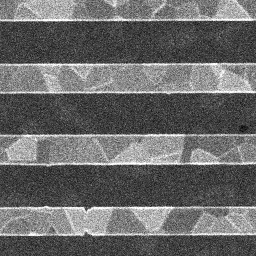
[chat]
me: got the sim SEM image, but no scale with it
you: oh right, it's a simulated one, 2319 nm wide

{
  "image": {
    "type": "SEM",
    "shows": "one or a few lines or trenches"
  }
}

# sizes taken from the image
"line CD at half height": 255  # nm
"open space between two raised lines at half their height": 399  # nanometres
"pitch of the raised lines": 0.649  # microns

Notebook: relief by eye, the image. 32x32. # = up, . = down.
################################
################################
................................
................................
................................
................................
................................
................................
################################
################################
################################
#######.............##..........
................................
................................
................................
................................
................................
################################
################################
################################
...#####.....##.................
................................
................................
................................
................................
................................
################################
################################
################################
................................
................................
................................